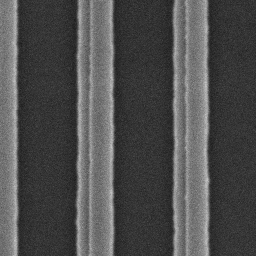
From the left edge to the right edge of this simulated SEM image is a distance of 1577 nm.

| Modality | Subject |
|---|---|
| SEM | lines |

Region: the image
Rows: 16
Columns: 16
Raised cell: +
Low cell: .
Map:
+....++....++...
+....++....++...
+....++....++...
+....++....++...
+....++....++...
+....++....++...
+....++....++...
+....++....++...
+....++....++...
+....++....++...
+....++....++...
+....++....++...
+....++....++...
+....++....++...
+....++....++...
+....++....++...